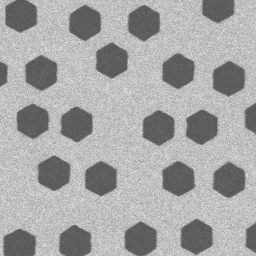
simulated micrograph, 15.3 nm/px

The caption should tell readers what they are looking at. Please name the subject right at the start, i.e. a regular array of holes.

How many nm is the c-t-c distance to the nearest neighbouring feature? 725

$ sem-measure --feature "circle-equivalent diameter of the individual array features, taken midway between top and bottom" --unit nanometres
508